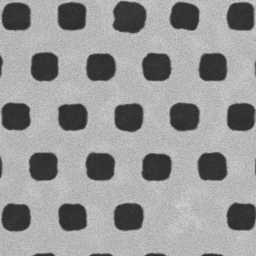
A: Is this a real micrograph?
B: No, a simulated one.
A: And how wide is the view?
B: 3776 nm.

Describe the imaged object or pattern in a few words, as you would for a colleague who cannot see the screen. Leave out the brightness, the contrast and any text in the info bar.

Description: a regular array of holes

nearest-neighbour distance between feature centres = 826 nm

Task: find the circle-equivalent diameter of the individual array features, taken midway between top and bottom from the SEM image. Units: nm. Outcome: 443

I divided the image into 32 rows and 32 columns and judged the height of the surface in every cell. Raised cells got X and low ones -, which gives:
X--XXXXX--XXXXX--XXXXX--XXXXX--X
----XXX----XXX----XXX----XXX----
----XXX----XXX----XXX----XXX----
X--XXXXX--XXXX----XXXX---XXXX---
XXXXXXXXXXXXXXXXXXXXXXXXXXXXXXXX
XXXXXXXXXXXXXXXXXXXXXXXXXXXXXXXX
XXXXX-XXXXXXXXXXXXXXXXXXXXXXXXXX
XXXX---XXXX---XXXX---XXXX---XXXX
XXXX---XXXX---XXXX---XXXX---XXXX
XXXX---XXXX---XXXX---XXXX---XXXX
XXXXXXXXXXXXXXXXXXXXXXXXXXXXXXXX
XXXXXXXXXXXXXXXXXXXXXXXXXXXXXXXX
XXXXXXXXXXXXXXXXXXXXXXXXXXXXXXXX
----XXX----XXXX---XXX----XXXX---
----XXX----XXX----XXX----XXX----
----XXX----XXX----XXX----XXX----
XXXXXXXXXXXXXXXXXXXXXXXXXXXXXXXX
XXXXXXXXXXXXXXXXXXXXXXXXXXXXXXXX
XXXXXXXXXXXXXXXXXXXXXXXXXXXXXXXX
XXXX---XXXX---XXXX---XXXX---XXXX
XXXX---XXXX---XXXX---XXXX---XXXX
XXXX---XXXX---XXXX---XXXX---XXXX
XXXXX-XXXXXX-XXXXX---XXXXX--XXXX
XXXXXXXXXXXXXXXXXXXXXXXXXXXXXXXX
XXXXXXXXXXXXXXXXXXXXXXXXXXXXXXXX
X--XXXXX--XXXXX--XXXXXXXXXXXX--X
----XXX----XXX----XXXXXXXXXX----
----XXX----XXX----XXXXXXXXXX----
X--XXXXX---XXXX--XXXXXXXXXXXX--X
XXXXXXXXXXXXXXXXXXXXXXXXXXXXXXXX
XXXXXXXXXXXXXXXXXXXXXXXXXXXXXXXX
XXXXXXXXXXXXXXXXXXXXXXXXXXXXXXXX